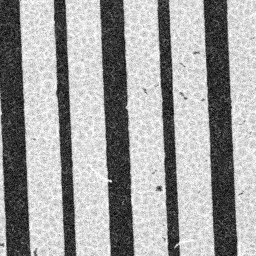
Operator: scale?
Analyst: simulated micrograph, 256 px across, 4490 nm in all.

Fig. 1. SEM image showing parallel lines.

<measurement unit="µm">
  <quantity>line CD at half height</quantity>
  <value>0.591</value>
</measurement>